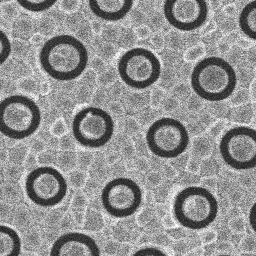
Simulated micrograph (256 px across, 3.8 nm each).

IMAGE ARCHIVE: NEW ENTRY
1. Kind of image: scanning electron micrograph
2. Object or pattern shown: a regular array of ring-shaped grooves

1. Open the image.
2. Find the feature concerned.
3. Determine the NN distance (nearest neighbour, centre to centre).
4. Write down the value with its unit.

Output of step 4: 284 nm